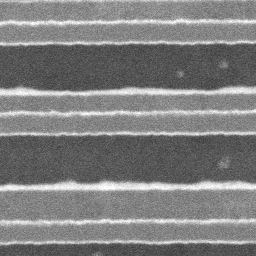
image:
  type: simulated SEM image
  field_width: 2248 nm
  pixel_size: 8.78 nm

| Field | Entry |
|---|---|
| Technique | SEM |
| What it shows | lines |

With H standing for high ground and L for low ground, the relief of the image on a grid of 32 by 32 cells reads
HHHHHHHHHHHHHHHHHHHHHHHHHHHHHHHH
HHHHHHHHHHHHHHHHHHHHHHHHHHHHHHHH
HHHHHHHHHHHHHHHHHHHHHHHHHHHHHHHH
HHHHHHHHHHHHHHHHHHHHHHHHHHHHHHHH
HHHHHHHHHHHHHHHHHHHHHHHHHHHHHHHH
HHHHHHLLHLHHHLLLLLLLLLLLLLLLLLLL
LLLLLLLLLLLLLLLLLLLLLLLLLLLLLLLL
LLLLLLLLLLLLLLLLLLLLLLLLLLLLLLLL
LLLLLLLLLLLLLLLLLLLLLLLLLLLLLLLL
LLLLLLLLLLLLLLLLLLLLLLLLLLLLLLLL
LLLLLLLLLLLLLLLLLLLLLLLLLLLLLLLL
LLLLLLLLLLLLLLLLLLLLLLLLLLLLLLHL
HHHHHHHHHHHHHHHHHHHHHHHHHHHHHHHH
HHHHHHHHHHHHHHHHHHHHHHHHHHHHHHHH
HHHHHHHHHHHHHHHHHHHHHHHHHHHHHHHH
HHHHHHHHHHHHHHHHHHHHHHHHHHHHHHHH
HHHHHHHHHHHHHHHHHHHHHHHHHHHHHHHH
LLLLLLLLLLLLLLLLLLLLLLLLLLLLLLLL
LLLLLLLLLLLLLLLLLLLLLLLLLLLLLLLL
LLLLLLLLLLLLLLLLLLLLLLLLLLLLLLLL
LLLLLLLLLLLLLLLLLLLLLLLLLLLLLLLL
LLLLLLLLLLLLLLLLLLLLLLLLLLLLLLLL
LLLLLLLLLLLLLLLLLLLLLLLLLLLLLLLL
LLLLLLLLLLLLLHHHHHLHLLLLHHHHHHHH
HHHHHHHHHHHHHHHHHHHHHHHHHHHHHHHH
HHHHHHHHHHHHHHHHHHHHHHHHHHHHHHHH
HHHHHHHHHHHHHHHHHHHHHHHHHHHHHHHH
HHHHHHHHHHHHHHHHHHHHHHHHHHHHHHHH
HHHHHHHHHHHHHHHHHHHHHHHHHHHHHHHH
HHHHHHHHHHHHHHHHHHHHHHHHHHHHHHHH
LLLLLLLLLLLLLLLLLLLLLLLLLLLLLLLL
LLLLLLLLLLLLLLLLLLLLLLLLLLLLLLLL